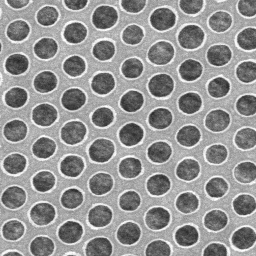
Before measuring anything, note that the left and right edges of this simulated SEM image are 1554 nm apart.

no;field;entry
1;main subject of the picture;a regular array of holes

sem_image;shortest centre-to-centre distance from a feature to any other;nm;199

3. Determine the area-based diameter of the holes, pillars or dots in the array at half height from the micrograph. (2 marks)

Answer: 142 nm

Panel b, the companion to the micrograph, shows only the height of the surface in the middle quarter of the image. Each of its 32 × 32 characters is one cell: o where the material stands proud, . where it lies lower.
......oooooooo......ooooooooo...
.....ooooooooo......ooooooooo...
o....ooo....oo.....oooo...ooo...
ooooooo.....ooo...oooo.....oo...
ooooooo......oooooooo.......oooo
ooooooo......oooooooo.......oooo
o...ooo.....oooo.oooo......ooooo
.....ooo...oooo.....oo.....ooo..
......oooooooo......ooooooooo...
......oooooooo......oooooooo....
.....ooooooooo......oooooooo....
o..ooooo....ooo....ooo....ooo...
ooooooo......oooooooo......ooo..
ooooooo......oooooooo......ooooo
o...ooo.....ooooooooo......ooooo
......oo...oooo....oo.....oooo..
......oooooooo......ooooooooo...
......oooooooo......oooooooo....
.....oooo.oooo......oooooooo....
....ooo.....oo.....oooo...oo....
oooooo.......oo..oooo......ooo..
oooooo.......oooooooo......ooooo
oooooo......ooooooooo......ooooo
....oo......ooo...ooo......ooooo
.....ooo..oooo.....ooo...oooo...
.....oooooooo......ooooooooo....
.....oooooooo......ooooooooo....
....oooo...ooo.....oooo..ooo....
oo.oooo.....ooo...ooo.....ooo...
oooooo.......oooooooo......ooooo
oooooo......oooooooo.......ooooo
....ooo.....oooo.oooo.....oooooo